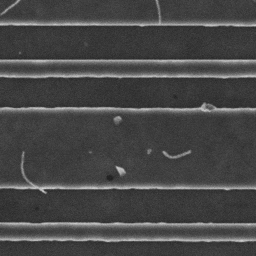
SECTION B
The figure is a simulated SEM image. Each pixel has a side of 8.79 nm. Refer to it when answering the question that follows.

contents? lines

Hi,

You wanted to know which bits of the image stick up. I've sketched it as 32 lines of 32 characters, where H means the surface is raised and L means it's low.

HHHHHHHHHHHHHHHHHHHHHHHHHHHHHHHH
HHHHHHHHHHHHHHHHHHHHHHHHHHHHHHHH
HHHHHHHHHHHHHHHHHHHHHHHHHHHHHHHH
LLLLLLLLLLLLLLLLLLLLLLLLLLLLLLLL
LLLLLLLLLLLLLLLLLLLLLLLLLLLLLLLL
LLLLLLLLLLLLLLLLLLLLLLLLLLLLLLLL
LLLLLLLLLLLLLLLLLLLLLLLLLLLLLLLL
LLLLLLLLLLLLLLLLLLLLLLLLLLLLLLLL
HHHHHHHHHHHHHHHHHHHHHHHHHHHHHHHH
HHHHHHHHHHHHHHHHHHHHHHHHHHHHHHHH
LLLLLLLLLLLLLLLLLLLLLLLLLLLLLLLL
LLLLLLLLLLLLLLLLLLLLLLLLLLLLLLLL
LLLLLLLLLLLLLLLLLLLLLLLLLLLLLLLL
HHLHHHLHHHHLHHLLLLLLLLLLLHHLLLLL
HHHHHHHHHHHHHHHHHHHHHHHHHHHHHHHH
HHHHHHHHHHHHHHHHHHHHHHHHHHHHHHHH
HHHHHHHHHHHHHHHHHHHHHHHHHHHHHHHH
HHHHHHHHHHHHHHHHHHHHHHHHHHHHHHHH
HHHHHHHHHHHHHHHHHHHHHHHHHHHHHHHH
HHHHHHHHHHHHHHHHHHHHHHHHHHHHHHHH
HHHHHHHHHHHHHHHHHHHHHHHHHHHHHHHH
HHHHHHHHHHHHHHHHHHHHHHHHHHHHHHHH
HHHHHHHHHHHHHHHHHHHHHHHHHHHHHHHH
LLHHHHHHHHHHHHHHLLLLHHHHHHHHHHHH
LLLLLLLLLLLLLLLLLLLLLLLLLLLLLLLL
LLLLLLLLLLLLLLLLLLLLLLLLLLLLLLLL
LLLLLLLLLLLLLLLLLLLLLLLLLLLLLLLL
LLLLLLLLLLLLLLLLLLLLLLLLLLLLLLLL
HHHHHHHHHHHHHHHHHHHHHHHHHHHHHHHH
HHHHHHHHHHHHHHHHHHHHHHHHHHHHHHHH
LLLLLLLLLLLLLLLLLLLLLLLLLLLLLLLL
LLLLLLLLLLLLLLLLLLLLLLLLLLLLLLLL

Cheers